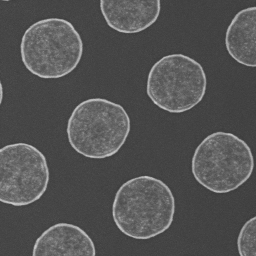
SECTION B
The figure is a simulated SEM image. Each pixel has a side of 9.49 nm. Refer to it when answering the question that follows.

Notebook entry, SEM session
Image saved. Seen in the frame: raised bodies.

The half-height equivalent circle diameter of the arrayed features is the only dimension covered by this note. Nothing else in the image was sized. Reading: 58.6 pixels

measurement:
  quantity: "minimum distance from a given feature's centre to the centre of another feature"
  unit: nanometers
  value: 860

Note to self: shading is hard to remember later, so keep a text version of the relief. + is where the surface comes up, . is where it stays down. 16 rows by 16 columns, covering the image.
......++++......
..++...++.....++
.++++.........++
.++++..........+
..++.....++++...
.........++++...
.....++...++....
....++++........
....++++.....++.
++...++.....++++
+++.........++++
+++.....++...++.
++.....++++.....
.......++++.....
...++...++.....+
..++++.........+